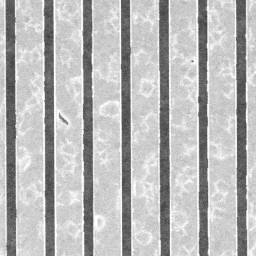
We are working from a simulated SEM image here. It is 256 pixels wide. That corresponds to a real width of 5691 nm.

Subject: parallel lines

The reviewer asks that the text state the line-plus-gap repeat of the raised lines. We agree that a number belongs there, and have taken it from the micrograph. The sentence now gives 0.852 µm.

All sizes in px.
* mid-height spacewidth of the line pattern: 11.2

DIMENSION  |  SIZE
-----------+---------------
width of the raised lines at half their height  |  0.608 micrometres